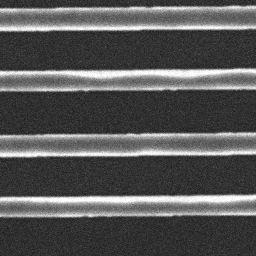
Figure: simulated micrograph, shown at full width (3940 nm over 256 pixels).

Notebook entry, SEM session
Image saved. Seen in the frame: lines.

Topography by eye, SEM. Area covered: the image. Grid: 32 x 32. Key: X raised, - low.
--------------------------------
XXXXXXXXXXXXXXXXXXXXXXXXXXXXXXXX
XXXXXXXXXXXXXXXXXXXXXXXXXXXXXXXX
XXXXXXXXXXXXXXXXXXXXXXXXXXX-----
--------------------------------
--------------------------------
--------------------------------
--------------------------------
--------------------------------
XXXXXXXXXXXXXXXXXXXXXXXXXXXXXXXX
XXXXXXXXXXXXXXXXXXXXXXXXXXXXXXXX
--------------------------------
--------------------------------
--------------------------------
--------------------------------
--------------------------------
--------------------------------
XXXXXXXXXXXXXXXXXXXXXXXXXXXXXXXX
XXXXXXXXXXXXXXXXXXXXXXXXXXXXXXXX
--------------------------------
--------------------------------
--------------------------------
--------------------------------
--------------------------------
--------------------------------
XXXXXXXXXXXXXXXXXXXXXXXXXXXXXXXX
XXXXXXXXXXXXXXXXXXXXXXXXXXXXXXXX
--------------------------------
--------------------------------
--------------------------------
--------------------------------
--------------------------------